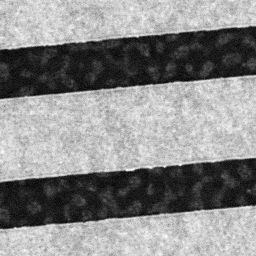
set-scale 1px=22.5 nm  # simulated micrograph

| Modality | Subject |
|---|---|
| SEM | one or a few lines or trenches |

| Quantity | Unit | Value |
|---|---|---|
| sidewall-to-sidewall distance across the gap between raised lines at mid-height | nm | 1130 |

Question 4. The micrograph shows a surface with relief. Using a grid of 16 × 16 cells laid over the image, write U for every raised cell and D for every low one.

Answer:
UUUUUUUUUUUUUUUU
UUUUUUUUUUUUUUUU
UUUUUUDDDDDDDDDD
DDDDDDDDDDDDDDDD
DDDDDDDDDDDDDDDD
DDDDDDDDUUUUUUUU
UUUUUUUUUUUUUUUU
UUUUUUUUUUUUUUUU
UUUUUUUUUUUUUUUU
UUUUUUUUUUUUUUUU
UUUUUUUUUDDDDDDD
DDDDDDDDDDDDDDDD
DDDDDDDDDDDDDDDD
DDDDDDDDDDUUUUUU
UUUUUUUUUUUUUUUU
UUUUUUUUUUUUUUUU